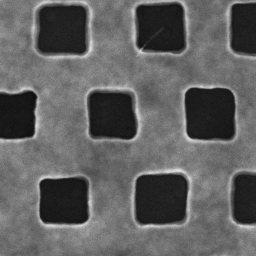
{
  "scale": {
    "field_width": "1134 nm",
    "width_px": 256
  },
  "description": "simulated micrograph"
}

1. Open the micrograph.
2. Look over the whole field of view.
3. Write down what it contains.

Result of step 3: holes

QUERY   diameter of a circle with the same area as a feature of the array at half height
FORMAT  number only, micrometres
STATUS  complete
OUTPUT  0.245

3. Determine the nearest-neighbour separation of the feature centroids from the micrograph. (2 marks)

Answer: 0.433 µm